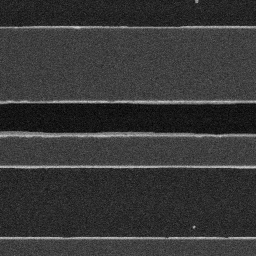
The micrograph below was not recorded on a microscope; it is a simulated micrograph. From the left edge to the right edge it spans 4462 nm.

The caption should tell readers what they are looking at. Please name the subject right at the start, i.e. lines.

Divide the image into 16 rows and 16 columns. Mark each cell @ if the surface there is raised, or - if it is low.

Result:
----------------
----------------
@@@@@@@@@@@@@@@@
@@@@@@@@@@@@@@@@
@@@@@@@@@@@@@@@@
@@@@@@@@@@@@@@@@
----------------
----------------
@@@@@@@@@@@@@@@@
@@@@@@@@@@@@@@@@
----------------
----------------
----------------
----------------
----------------
@@@@@@@@@@@@@@@@